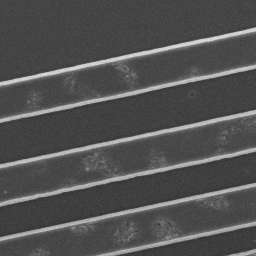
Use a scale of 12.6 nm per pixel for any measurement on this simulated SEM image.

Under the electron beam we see one or a few lines or trenches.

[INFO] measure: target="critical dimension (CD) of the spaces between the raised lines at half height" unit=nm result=434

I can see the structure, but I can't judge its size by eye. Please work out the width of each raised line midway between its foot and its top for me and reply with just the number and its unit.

468 nm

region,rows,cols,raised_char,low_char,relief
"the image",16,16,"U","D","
DDDDDDDDDDDDDDDD
DDDDDDDDDDDDDDDD
DDDDDDDDDDDDDUUU
DDDDDDDDUUUUUUUU
DDDDUUUUUUUUUUDD
UUUUUUUUUUDDDDDD
UUUUUDDDDDDDDDDD
DDDDDDDDDDDDDDUU
DDDDDDDDDUUUUUUU
DDDDUUUUUUUUUUUD
UUUUUUUUUUUDDDDD
UUUUUUDDDDDDDDDD
UDDDDDDDDDDUUUUU
DDDDDDDUUUUUUUUU
DDUUUUUUUUUUUUDD
UUUUUUUUUDDDDDDD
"